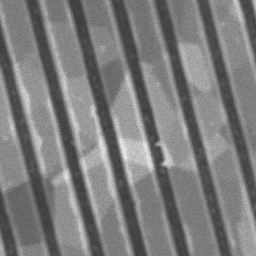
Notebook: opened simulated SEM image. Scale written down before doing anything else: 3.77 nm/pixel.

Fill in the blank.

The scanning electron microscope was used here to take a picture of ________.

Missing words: parallel lines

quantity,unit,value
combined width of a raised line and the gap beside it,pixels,41.4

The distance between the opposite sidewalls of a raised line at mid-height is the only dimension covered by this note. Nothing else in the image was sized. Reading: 103 nm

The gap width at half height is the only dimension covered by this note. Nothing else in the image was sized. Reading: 53.3 nm